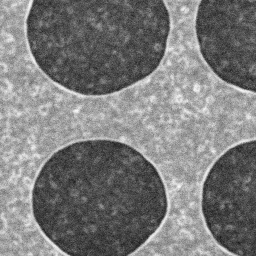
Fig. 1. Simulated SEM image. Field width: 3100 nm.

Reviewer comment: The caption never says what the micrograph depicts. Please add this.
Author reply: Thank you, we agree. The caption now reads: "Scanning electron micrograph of holes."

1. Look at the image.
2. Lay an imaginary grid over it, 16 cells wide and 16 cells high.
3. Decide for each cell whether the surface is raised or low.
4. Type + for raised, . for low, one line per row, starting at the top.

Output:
++........++....
++.........+....
++........++....
++........+++...
+++.......+++...
++++....+++++++.
++++++++++++++++
++++++++++++++++
++++++++++++++++
++++.....+++++..
+++.......+++...
++........+++...
++........+++...
++........+++...
+++.......+++...
++++.....+++++..